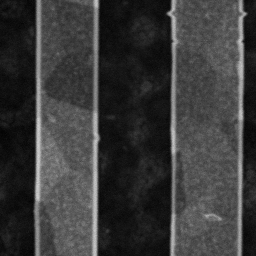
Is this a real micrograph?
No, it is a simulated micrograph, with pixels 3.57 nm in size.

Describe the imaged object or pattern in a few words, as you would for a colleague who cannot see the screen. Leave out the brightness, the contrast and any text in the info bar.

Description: one or a few lines or trenches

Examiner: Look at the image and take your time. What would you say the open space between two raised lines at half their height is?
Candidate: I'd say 275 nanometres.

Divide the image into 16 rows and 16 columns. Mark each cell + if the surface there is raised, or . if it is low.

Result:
..++++.....++++.
..++++.....++++.
..++++.....++++.
..++++.....++++.
..++++.....++++.
..++++.....++++.
..++++.....++++.
..++++.....++++.
..++++.....++++.
..++++.....++++.
..++++.....++++.
..++++.....++++.
..++++.....++++.
..++++.....++++.
..++++.....++++.
..++++.....++++.